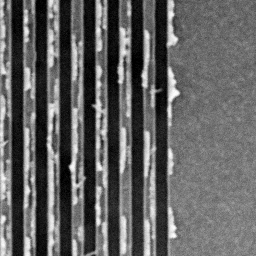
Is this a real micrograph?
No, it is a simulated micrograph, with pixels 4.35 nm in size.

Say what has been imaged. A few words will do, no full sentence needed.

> parallel lines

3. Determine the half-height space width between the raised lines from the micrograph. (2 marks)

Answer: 57.6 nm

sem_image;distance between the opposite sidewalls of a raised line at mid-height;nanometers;45.7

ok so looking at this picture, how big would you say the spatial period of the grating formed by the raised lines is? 104 nm